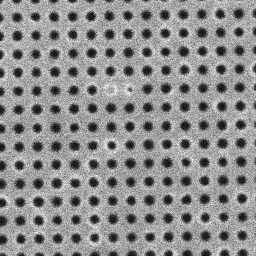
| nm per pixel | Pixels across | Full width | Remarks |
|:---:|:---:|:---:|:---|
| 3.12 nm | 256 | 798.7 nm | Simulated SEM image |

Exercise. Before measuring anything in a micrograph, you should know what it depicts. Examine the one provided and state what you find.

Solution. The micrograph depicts a regular array of holes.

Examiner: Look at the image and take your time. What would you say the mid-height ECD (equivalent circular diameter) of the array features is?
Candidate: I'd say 10.1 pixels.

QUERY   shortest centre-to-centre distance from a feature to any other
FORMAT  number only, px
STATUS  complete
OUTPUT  18.3